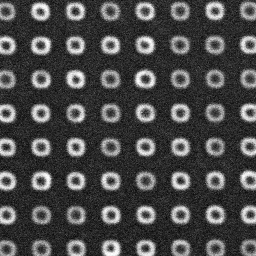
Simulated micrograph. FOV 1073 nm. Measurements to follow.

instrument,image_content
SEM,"a regular array of raised bodies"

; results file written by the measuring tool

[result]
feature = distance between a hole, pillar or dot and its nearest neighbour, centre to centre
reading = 0.142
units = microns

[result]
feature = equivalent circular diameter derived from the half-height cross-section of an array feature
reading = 16.8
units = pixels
